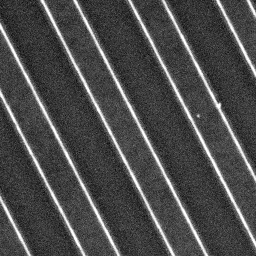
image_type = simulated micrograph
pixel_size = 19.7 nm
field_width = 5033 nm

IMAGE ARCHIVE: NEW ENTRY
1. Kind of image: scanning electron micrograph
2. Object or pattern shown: lines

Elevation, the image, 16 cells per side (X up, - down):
---XX---XX----XX
---XX----XX---XX
X---XX---XXX---X
X---XXX---XX---X
XX---XX---XXX---
XX---XXX---XX---
XXX---XX---XXX--
-XX---XXX---XX--
-XXX---XX---XXX-
--XX---XXX---XX-
--XXX---XX---XXX
---XX----XX---XX
---XXX---XX----X
X---XX----XX---X
X---XXX---XX----
XX---XX----XX---